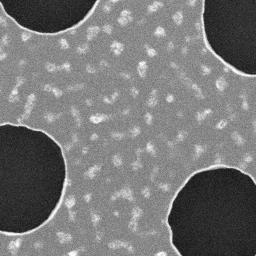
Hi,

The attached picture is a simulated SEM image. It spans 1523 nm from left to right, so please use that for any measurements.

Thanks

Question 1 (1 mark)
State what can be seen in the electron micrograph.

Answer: holes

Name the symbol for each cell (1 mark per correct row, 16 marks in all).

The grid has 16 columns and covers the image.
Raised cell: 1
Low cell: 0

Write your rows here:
0000001111111000
1000011111111000
1111111111111000
1111111111111100
1111111111111110
1111111111111111
1111111111111111
1111111111111111
0001111111111111
0000111111111111
0000111111111011
0000111111110000
0000111111100000
0001111111100000
0011111111100000
1111111111100000